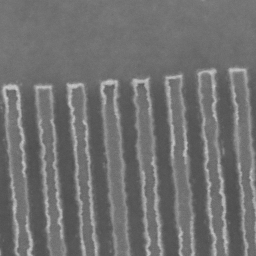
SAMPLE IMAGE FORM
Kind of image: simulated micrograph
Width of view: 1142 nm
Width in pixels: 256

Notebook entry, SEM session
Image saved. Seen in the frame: parallel lines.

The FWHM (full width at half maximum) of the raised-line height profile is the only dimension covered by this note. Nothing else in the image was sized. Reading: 67.2 nanometers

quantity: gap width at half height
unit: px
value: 17.7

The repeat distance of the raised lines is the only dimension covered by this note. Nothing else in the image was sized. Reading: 145 nm